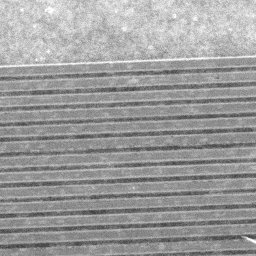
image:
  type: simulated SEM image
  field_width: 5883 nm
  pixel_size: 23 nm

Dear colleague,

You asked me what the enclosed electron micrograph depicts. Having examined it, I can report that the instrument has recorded parallel lines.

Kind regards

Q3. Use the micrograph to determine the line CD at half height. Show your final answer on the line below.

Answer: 0.224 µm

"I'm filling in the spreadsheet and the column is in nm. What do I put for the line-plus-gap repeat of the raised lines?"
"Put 350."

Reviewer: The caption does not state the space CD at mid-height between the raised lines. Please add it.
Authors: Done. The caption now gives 123 nanometers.